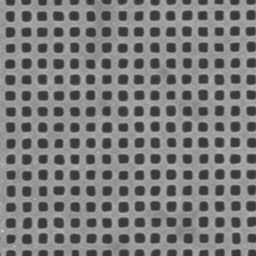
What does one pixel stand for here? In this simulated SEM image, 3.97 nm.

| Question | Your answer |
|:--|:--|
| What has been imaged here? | a regular array of holes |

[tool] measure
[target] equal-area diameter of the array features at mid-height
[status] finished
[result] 42.7 nm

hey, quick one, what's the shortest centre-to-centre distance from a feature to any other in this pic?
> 0.0618 microns